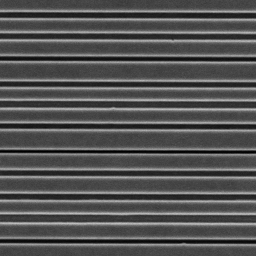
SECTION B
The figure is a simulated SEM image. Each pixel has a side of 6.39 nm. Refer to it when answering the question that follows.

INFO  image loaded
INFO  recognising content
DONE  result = parallel lines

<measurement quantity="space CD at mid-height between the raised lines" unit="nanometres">38.3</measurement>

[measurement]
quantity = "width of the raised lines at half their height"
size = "0.109 µm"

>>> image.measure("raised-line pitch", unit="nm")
146